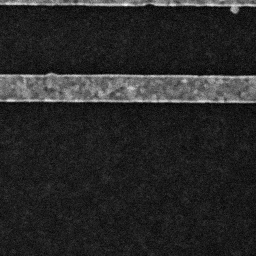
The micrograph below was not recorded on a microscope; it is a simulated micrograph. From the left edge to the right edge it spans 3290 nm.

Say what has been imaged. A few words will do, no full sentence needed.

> one or a few lines or trenches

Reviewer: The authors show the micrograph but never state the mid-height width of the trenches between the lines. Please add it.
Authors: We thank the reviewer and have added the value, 915 nm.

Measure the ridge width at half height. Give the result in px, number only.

25.5